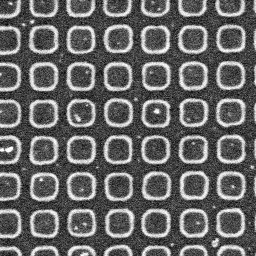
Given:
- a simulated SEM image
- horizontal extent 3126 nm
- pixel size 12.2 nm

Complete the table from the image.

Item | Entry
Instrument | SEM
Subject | a regular array of raised bodies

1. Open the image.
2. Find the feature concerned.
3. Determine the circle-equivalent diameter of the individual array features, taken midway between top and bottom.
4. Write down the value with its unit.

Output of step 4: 334 nm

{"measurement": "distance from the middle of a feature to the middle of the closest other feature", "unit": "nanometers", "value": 445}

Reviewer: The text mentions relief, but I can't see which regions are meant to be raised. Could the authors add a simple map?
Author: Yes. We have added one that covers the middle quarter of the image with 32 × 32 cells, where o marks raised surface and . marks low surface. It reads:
..ooooo....ooooo....ooooo.....oo
.oooooo...ooooooo...oooooo...ooo
.oooooo...ooooooo...oooooo...ooo
.oooooo...ooooooo...oooooo...ooo
.oooooo...oooooo....oooooo...ooo
..ooooo....ooooo....ooooo.....oo
................................
................................
................................
..oooo.....ooooo.....oooo.....oo
.oooooo...ooooooo...oooooo...ooo
.oooooo...ooooooo...oooooo...ooo
.oooooo...ooooooo...oooooo....oo
.oooooo...ooooooo...oooooo...ooo
..ooooo....ooooo....oooooo....oo
......................o.o.......
................................
................................
..oooo......ooo......oooo.....oo
.oooooo....ooooo....oooooo...ooo
.oooooo....ooooo....oooooo...ooo
.oooooo....oooooo...oooooo...ooo
.oooooo....oooooo...oooooo...ooo
.oooooo....ooooo....oooooo...ooo
...o.o......oooo.....o..........
................................
................................
...ooo.......oo.........o......o
.oooooo....oooooo....ooooo....oo
.oooooo....oooooo...oooooo...ooo
.oooooo....oooooo...oooooo...ooo
.oooooo....oooooo...oooooo...ooo